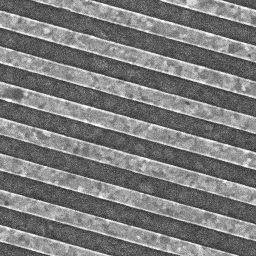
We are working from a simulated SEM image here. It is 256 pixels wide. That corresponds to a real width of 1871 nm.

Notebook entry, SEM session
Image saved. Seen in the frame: parallel lines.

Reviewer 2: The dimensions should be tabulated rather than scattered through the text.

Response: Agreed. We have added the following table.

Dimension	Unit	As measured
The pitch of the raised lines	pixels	34.4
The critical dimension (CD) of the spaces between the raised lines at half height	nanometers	142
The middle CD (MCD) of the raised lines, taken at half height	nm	112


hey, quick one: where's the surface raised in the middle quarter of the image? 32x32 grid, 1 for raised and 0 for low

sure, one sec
10000000000000000001111111111111
11111000000000000000000111111111
11111111000000000000000000011111
11111111111100000000000000000011
01111111111111100000000000000000
00000011111111111110000000000000
00000000011111111111111000000000
00000000000011111111111111000000
00000000000000001111111111111100
11000000000000000000111111111111
11111000000000000000000111111111
11111111100000000000000000011111
11111111111110000000000000000011
00111111111111110000000000000000
00000011111111111111000000000000
00000000111111111111111000000000
00000000000001111111111111100000
00000000000000001111111111111110
11000000000000000001111111111111
11111000000000000000000011111111
11111111100000000000000000011111
11111111111110000000000000000001
00111111111111110000000000000000
00000011111111111111000000000000
00000000011111111111111000000000
00000000000001111111111111100000
00000000000000001111111111111110
11000000000000000000111111111111
11111100000000000000000011111111
11111111110000000000000000011111
11111111111110000000000000000001
00111111111111110000000000000000